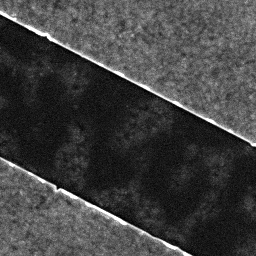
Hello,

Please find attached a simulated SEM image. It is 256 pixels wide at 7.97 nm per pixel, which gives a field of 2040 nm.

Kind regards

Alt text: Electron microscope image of one or a few lines or trenches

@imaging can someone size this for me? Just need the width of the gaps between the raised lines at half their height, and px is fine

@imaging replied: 128